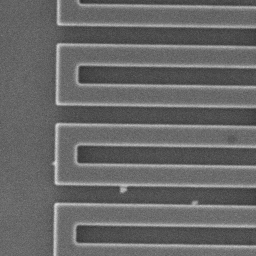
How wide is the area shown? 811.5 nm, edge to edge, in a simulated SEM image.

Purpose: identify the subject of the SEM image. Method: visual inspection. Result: groups of lines, slits or small figures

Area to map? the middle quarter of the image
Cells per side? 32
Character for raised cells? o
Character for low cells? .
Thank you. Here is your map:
oooo......................oooooo
ooo.............................
ooo.............................
ooo.............................
oooo............................
oooooooooooooooooooooooooooooooo
oooooooooooooooooooooooooooooooo
oooooooooooooooooooooooooooooooo
oooooooooooooooooooooooooooooooo
oooooooooooooooooooooooooooooooo
.................ooooooooooooooo
................................
................................
................................
................................
oooooooooooooooooooooooooooooooo
oooooooooooooooooooooooooooooooo
oooooooooooooooooooooooooooooooo
oooooooooooooooooooooooooooooooo
oooooooooooooooooooooooooooooooo
oooo....................oooooooo
ooo.............................
ooo.............................
ooo.............................
ooo.............................
oooooooooooooooooooooooooooooooo
oooooooooooooooooooooooooooooooo
oooooooooooooooooooooooooooooooo
oooooooooooooooooooooooooooooooo
oooooooooooooooooooooooooooooooo
..............................oo
................................